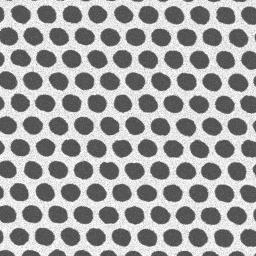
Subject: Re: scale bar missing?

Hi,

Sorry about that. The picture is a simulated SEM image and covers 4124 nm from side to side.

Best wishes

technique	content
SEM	a regular array of holes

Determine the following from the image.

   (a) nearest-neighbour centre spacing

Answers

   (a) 0.407 micrometres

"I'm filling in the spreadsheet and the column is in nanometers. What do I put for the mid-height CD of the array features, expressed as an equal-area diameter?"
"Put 304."